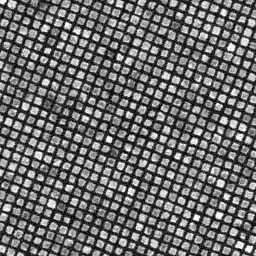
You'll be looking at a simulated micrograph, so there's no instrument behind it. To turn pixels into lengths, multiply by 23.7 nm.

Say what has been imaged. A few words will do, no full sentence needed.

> a regular array of raised bodies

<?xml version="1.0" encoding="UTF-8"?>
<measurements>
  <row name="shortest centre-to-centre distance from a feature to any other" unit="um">0.229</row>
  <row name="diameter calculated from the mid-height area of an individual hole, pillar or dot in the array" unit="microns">0.151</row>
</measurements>